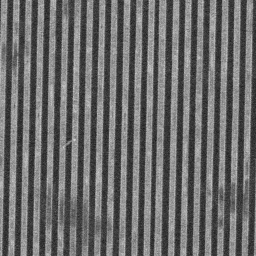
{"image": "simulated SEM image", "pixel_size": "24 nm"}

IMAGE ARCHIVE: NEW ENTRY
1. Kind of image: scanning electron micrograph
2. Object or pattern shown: parallel lines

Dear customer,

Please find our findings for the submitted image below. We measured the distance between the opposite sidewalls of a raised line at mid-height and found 126 nanometers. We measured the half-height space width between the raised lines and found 174 nanometers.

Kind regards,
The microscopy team